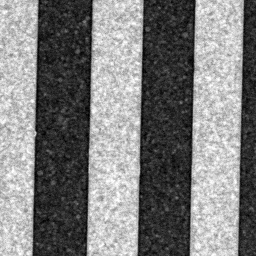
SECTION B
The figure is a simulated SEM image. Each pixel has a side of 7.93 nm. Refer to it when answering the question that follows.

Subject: one or a few lines or trenches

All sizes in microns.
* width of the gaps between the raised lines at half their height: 0.419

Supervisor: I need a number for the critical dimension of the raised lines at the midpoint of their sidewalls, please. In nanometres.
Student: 376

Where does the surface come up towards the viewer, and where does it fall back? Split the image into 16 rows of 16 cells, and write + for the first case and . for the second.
++....+++...+++.
++....+++...+++.
++....+++...+++.
++....+++...+++.
++....+++...+++.
++....+++...+++.
++....+++...+++.
++....+++...+++.
++....+++...+++.
++....+++...+++.
++....+++...+++.
++....+++...+++.
++....+++...+++.
++....+++...+++.
++...++++...+++.
++...++++...+++.